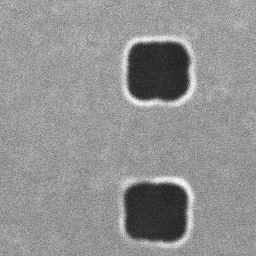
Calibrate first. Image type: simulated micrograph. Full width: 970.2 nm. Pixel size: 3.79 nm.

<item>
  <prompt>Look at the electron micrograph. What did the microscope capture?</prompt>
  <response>holes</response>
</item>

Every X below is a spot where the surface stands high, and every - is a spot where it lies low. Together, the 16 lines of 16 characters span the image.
XXXXXXXXXXXXXXXX
XXXXXXXXXXXXXXXX
XXXXXXXXXXXXXXXX
XXXXXXXX----XXXX
XXXXXXXX----XXXX
XXXXXXXX----XXXX
XXXXXXXXXXXXXXXX
XXXXXXXXXXXXXXXX
XXXXXXXXXXXXXXXX
XXXXXXXXXXXXXXXX
XXXXXXXXXXXXXXXX
XXXXXXXX---XXXXX
XXXXXXXX----XXXX
XXXXXXXX----XXXX
XXXXXXXX----XXXX
XXXXXXXXXXXXXXXX